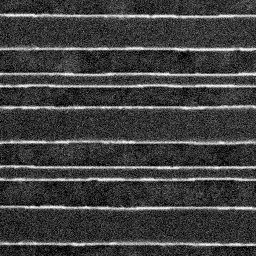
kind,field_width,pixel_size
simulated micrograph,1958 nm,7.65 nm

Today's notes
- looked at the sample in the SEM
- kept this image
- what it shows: lines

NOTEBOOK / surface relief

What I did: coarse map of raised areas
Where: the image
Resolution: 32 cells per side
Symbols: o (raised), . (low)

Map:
................................
................................
oooooooooooooooooooooooooooooooo
oooooooooooooooooooooooooooooooo
oooooooooooooooooooooooooooooooo
oooooooooooooooooooooooooooooooo
................................
................................
................................
oooooooooooooooooooooooooooooooo
oooooooooooooooooooooooooooooooo
................................
................................
oooooooooooooooooooooooooooooooo
oooooooooooooooooooooooooooooooo
oooooooooooooooooooooooooooooooo
oooooooooooooooooooooooooooooooo
oooooooooooooooooooooooooooooooo
................................
................................
................................
oooooooooooooooooooooooooooooooo
ooooooooooooooooooooooooo....ooo
................................
................................
................................
oooooooooooooooooooooooooooooooo
oooooooooooooooooooooooooooooooo
oooooooooooooooooooooooooooooooo
oooooooooooooooooooooooooooooooo
oooooooooooooooooooooooooooooooo
................................